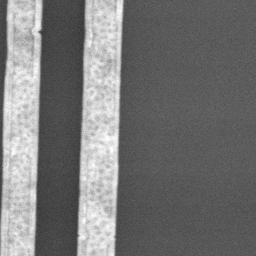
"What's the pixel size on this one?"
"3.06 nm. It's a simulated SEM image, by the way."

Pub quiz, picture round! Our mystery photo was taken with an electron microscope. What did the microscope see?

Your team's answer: one or a few lines or trenches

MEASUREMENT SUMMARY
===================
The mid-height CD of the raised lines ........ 99.9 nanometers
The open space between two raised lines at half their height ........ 46.5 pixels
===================